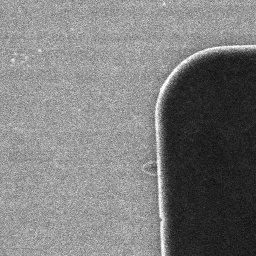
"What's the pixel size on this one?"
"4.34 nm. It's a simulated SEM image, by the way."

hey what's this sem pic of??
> one or a few lines or trenches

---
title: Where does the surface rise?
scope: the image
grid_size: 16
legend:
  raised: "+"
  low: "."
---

................
................
................
............++++
...........+++++
..........++++++
..........++++++
..........++++++
..........++++++
..........++++++
..........++++++
..........++++++
..........++++++
..........++++++
..........++++++
..........++++++